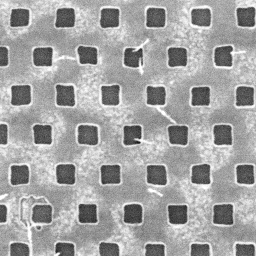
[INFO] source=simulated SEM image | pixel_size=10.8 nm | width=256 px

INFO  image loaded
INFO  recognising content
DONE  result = a regular array of holes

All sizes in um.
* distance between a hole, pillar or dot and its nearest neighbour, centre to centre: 0.48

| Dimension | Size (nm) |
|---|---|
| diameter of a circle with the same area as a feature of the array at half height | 237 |